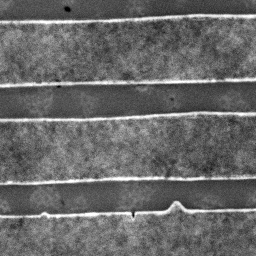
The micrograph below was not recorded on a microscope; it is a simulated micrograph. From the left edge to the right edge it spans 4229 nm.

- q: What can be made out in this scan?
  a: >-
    one or a few lines or trenches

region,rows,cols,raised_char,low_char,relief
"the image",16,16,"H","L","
LLLLLLLLLLLLLLLL
HHHHHHHHHHHHHHHH
HHHHHHHHHHHHHHHH
HHHHHHHHHHHHHHHH
HHHHHHHHHHHHHHHH
LLLLLLLLLLLLLLLL
LLLLLLLLLLLLLLLL
LHLHLHHHHHHHHHHH
HHHHHHHHHHHHHHHH
HHHHHHHHHHHHHHHH
HHHHHHHHHHHHHHHH
LLLLLLLLLLLLLLLL
LLLLLLLLLLLLLLLL
LLHHHHHHHHHHHHHH
HHHHHHHHHHHHHHHH
HHHHHHHHHHHHHHHH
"